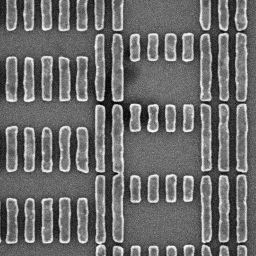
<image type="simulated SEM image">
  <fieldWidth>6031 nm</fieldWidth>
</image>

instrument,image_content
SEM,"wiring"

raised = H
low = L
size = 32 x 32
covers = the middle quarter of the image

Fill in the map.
HLLLHHLLHHLLHHHLLLLLLLLLLLLLLLLL
HLLLHHLLHHLLHHHLLLLLLLLLLLLLLLLL
HLLHHLLLHHLLHHHLLLLLLLLLLLLLLLLL
HLLHHLLLHHLLHHHLLLLLLLLLLLLLLLLL
HLLHHHLLHHLLHHHLLLLLLLLLLLLLLLLL
HLLHHHLLHHLLHHHLLLLLLLLLLLLLLLLL
HLLHHLLLHHLLHHHLLLLLLLLLLLLLLLLL
HLLHHHLLHHLLHHHLLLLLLLLLLLLLLLLL
HLLHHHLLHHLLHHHLLLLLLLLLLLLLLLLL
LLLLLLLLLLLLLLLLLLLLLLLLLLLLLLLL
LLLLLLLLHLLLLHLLLHHLLHHLLLHLLLHH
LLLLLLLLHHLLHHLLLHHLLHHLLLHHLLHH
LLLLLLLLHHLLHHLLLHHLLHHLLLHHLLHH
LLLLLLLLHHLLHHLLLHHLLHHLLLHHLLHH
LLLLLLLLHHLLHHHLLHHLLHHLLLHHLLHH
LLLLLLLLHHLLHHHLLHHLLHHLLLHHLLHH
HHLHHHLLHHLLHHHLLHHLLHHLLLHHLLHH
HHLHHHLLHHLLHHHLLLLLLLLLLLLLLLLL
HLLLHHLLHHLLHHLLLLLLLLLLLLLLLLLL
HLLLHHLLHHLLHHLLLLLLLLLLLLLLLLLL
HLLLHHLLHHLLHHHLLLLLLLLLLLLLLLLL
HLLHHHLLHHLLHHHLLLLLLLLLLLLLLLLL
HLLHHHLLHHLLHHHLLLLLLLLLLLLLLLLL
HLLHHHLLHHLLHHHLLLLLLLLLLLLLLLLL
HLLHHHLLHHLLHHHLLLLLLLLLLLLLLLLL
HLLHHHLLHHLLHHHLLLLLLLLLLLLLLLLL
HLLLHHLLHHLLHHHLLLLLLLLLLLLLLLLL
LLLLLLLLLLLLLHHLLLLLLLLLLLLLLLLL
LLLLLLLLHHLLHHHLLHHLLHHLLLHHLLHH
LLLLLLLLHHLLHHHLLHHLLHHLLLHHLLHH
LLLLLLLLHHLLHHHLLHHLLHHLLLHHLLHH
LLLLLLLLHHLLHHHLLHHLLHHLLLHHLLHH